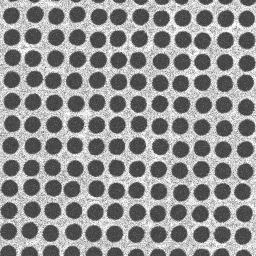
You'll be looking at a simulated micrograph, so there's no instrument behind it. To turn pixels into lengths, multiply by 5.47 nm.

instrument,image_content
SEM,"a regular array of holes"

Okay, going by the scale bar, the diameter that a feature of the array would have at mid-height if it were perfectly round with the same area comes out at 89.7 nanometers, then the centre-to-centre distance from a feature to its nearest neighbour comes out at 113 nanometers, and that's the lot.